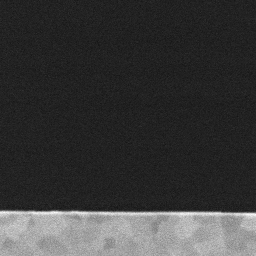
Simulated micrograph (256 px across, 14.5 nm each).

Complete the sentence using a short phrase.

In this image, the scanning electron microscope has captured wiring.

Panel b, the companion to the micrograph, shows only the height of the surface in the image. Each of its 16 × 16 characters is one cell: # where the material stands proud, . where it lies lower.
................
................
................
................
................
................
................
................
................
................
................
................
................
################
################
################